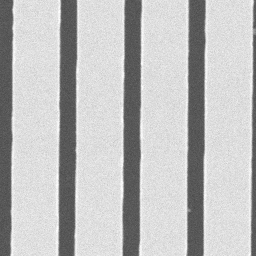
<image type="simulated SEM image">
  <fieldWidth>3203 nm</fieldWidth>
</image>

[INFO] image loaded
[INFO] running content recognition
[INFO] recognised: lines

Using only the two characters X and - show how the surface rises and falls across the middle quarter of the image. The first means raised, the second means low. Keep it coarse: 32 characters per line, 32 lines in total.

---XXXXXXXXXXXX----XXXXXXXXXXXX-
---XXXXXXXXXXXX----XXXXXXXXXXXX-
---XXXXXXXXXXXX----XXXXXXXXXXXX-
---XXXXXXXXXXXX----XXXXXXXXXXXX-
---XXXXXXXXXXXX----XXXXXXXXXXXX-
---XXXXXXXXXXXX----XXXXXXXXXXXX-
---XXXXXXXXXXXX----XXXXXXXXXXXX-
---XXXXXXXXXXXX----XXXXXXXXXXXX-
---XXXXXXXXXXXX----XXXXXXXXXXXX-
---XXXXXXXXXXXX----XXXXXXXXXXXX-
---XXXXXXXXXXXX----XXXXXXXXXXXX-
---XXXXXXXXXXXX----XXXXXXXXXXXX-
---XXXXXXXXXXXX----XXXXXXXXXXXX-
---XXXXXXXXXXXX----XXXXXXXXXXXX-
---XXXXXXXXXXXX----XXXXXXXXXXXX-
---XXXXXXXXXXXX----XXXXXXXXXXXX-
---XXXXXXXXXXXX----XXXXXXXXXXXX-
---XXXXXXXXXXXX----XXXXXXXXXXXX-
---XXXXXXXXXXXX----XXXXXXXXXXXX-
---XXXXXXXXXXXX----XXXXXXXXXXXX-
---XXXXXXXXXXXX----XXXXXXXXXXXX-
---XXXXXXXXXXXX----XXXXXXXXXXXX-
---XXXXXXXXXXXX----XXXXXXXXXXXX-
---XXXXXXXXXXXX----XXXXXXXXXXXX-
---XXXXXXXXXXXX----XXXXXXXXXXXX-
---XXXXXXXXXXXX----XXXXXXXXXXXX-
---XXXXXXXXXXXX----XXXXXXXXXXXX-
---XXXXXXXXXXXX----XXXXXXXXXXXX-
---XXXXXXXXXXXX----XXXXXXXXXXXX-
---XXXXXXXXXXXX----XXXXXXXXXXXX-
---XXXXXXXXXXXX----XXXXXXXXXXXX-
---XXXXXXXXXXXX----XXXXXXXXXXXX-